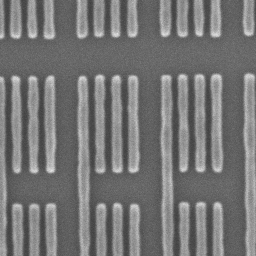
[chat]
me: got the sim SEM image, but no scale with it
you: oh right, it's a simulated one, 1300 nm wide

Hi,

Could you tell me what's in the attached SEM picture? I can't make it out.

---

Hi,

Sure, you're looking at wiring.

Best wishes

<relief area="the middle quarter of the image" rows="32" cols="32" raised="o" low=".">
................................
................................
................................
....o...oo..oo..oo.......o...oo.
....oo..oo..oo..oo.......o...oo.
....oo..oo..oo..oo.......o...oo.
....oo..oo..oo..oo.......oo..oo.
....oo..oo..oo..oo.......oo..oo.
....oo..oo..oo..oo.......oo..oo.
....oo..oo..oo..oo.......oo..oo.
....oo..oo..oo..oo.......oo..oo.
....oo..oo..oo..oo.......oo..oo.
....oo..oo..oo..oo.......oo..oo.
....oo..oo..oo..oo.......oo..oo.
....oo..oo..oo..oo.......oo..oo.
....oo..oo..oo..oo.......oo..oo.
....oo..oo..oo..oo.......oo..oo.
....oo..oo..oo..oo......ooo..oo.
....oo..oo..oo..oo......ooo..oo.
....oo..oo..oo..oo......ooo..oo.
....oo..oo..oo..oo......ooo..oo.
....oo..oo..oo..oo.......oo..oo.
....oo..oo..oo..ooo......oo..oo.
....oo..oo..oo..ooo......oo..oo.
....oo..oo..oo..oo.......oo..oo.
....oo..oo..oo..oo.......oo..oo.
....oo..oo..oo..oo.......oo..o..
....oo...................oo.....
....oo...................oo.....
....oo...................oo.....
....oo...................oo.....
....oo...................oo.....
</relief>